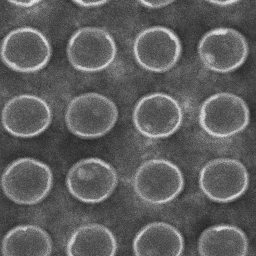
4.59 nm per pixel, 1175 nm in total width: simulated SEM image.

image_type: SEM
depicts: a regular array of raised bodies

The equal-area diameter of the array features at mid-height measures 212 nm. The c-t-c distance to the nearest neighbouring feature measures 299 nanometres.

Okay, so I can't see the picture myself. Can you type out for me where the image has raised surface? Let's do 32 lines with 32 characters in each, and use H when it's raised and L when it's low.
LLHHLLLLLLHHLLLLLLHHHLLLLLLHHLLL
LLLLLLLLLLLLLLLLLLLLLLLLLLLLLLLL
LLLLLLLLLLLLLLLLLLLLLLLLLLLLLLLL
LLLLLLLLLLLLLLLLLLLHLLLLLLLLLLLL
LHHHHLLLLHHHHHLLLHHHHHLLLLHHHHLL
HHHHHHLLLHHHHHLLLHHHHHLLLHHHHHHL
HHHHHHLLLHHHHHLLLHHHHHLLLHHHHHHL
LHHHHHLLLHHHHHLLLHHHHHLLLHHHHHLL
LLHHHLLLLLHHHLLLLLHHHLLLLLHHHLLL
LLLLLLLLLLLLLLLLLLLLLLLLLLLLLLLL
LLLLLLLLLLLLLLLLLLLLLLLLLLLLLLLL
LLLLLLLLLLLLLLLLLLLLLLLLLLLLLLLL
LLHHHLLLLHHHHLLLLLHHHHLLLLHHHHLL
LHHHHHLLLHHHHHLLLHHHHHLLLHHHHHHL
HHHHHHLLHHHHHHHLLHHHHHHLLHHHHHHL
LHHHHHLLLHHHHHLLLHHHHHLLLHHHHHHL
LHHHHLLLLHHHHLLLLLHHHHLLLLHHHHLL
LLLLLLLLLLLLLLLLLLLLLLLLLLLLLLLL
LLLLLLLLLLLLLLLLLLLLLLLLLLLLLLLL
LLLLLLLLLLLLLLLLLLLLLLLLLLLLLLLL
LLHHHLLLLLHHHLLLLLHHHLLLLLHHHHLL
LHHHHHLLLHHHHHLLLHHHHHHLLHHHHHHL
HHHHHHLLLHHHHHLLLHHHHHHLLHHHHHHL
HHHHHHLLLHHHHHLLLHHHHHHLLHHHHHHL
LHHHHLLLLHHHHLLLLLHHHHLLLLHHHHLL
LLLLLLLLLLLLLLLLLLLLLLLLLLLLLLLL
LLLLLLLLLLLLLLLLLLLLLLLLLLLLLLLL
LLLLLLLLLLLLLLLLLLLLLLLLLLLLLLLL
LLHHHLLLLLHHHLLLLLHHHHLLLLLHHLLL
LHHHHHLLLHHHHHLLLHHHHHHLLHHHHHLL
LHHHHHLLLHHHHHLLLHHHHHHLLHHHHHHL
LHHHHHLLHHHHHHLLLHHHHHHLLHHHHHHL